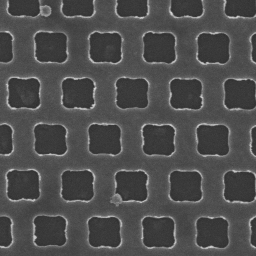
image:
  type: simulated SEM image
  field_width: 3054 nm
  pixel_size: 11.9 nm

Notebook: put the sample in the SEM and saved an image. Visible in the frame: a regular array of holes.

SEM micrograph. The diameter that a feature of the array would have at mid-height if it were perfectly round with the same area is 405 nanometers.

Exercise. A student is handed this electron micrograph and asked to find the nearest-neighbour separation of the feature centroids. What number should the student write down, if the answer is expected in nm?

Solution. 633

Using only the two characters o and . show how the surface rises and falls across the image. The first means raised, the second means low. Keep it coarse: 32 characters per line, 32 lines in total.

o....ooo....ooo...ooo....ooo....
o....ooo....ooo...ooo....ooo....
oooooooooooooooooooooooooooooooo
oooooooooooooooooooooooooooooooo
.ooo....ooo....ooo....ooo...oooo
.ooo....ooo....ooo....ooo....oo.
..oo....ooo....ooo....ooo....ooo
.oooo...oooo...ooo....ooo....ooo
oooooooooooooooooooooooooooooooo
oooooooooooooooooooooooooooooooo
o....ooo....ooo...ooo....ooo....
o....ooo....ooo...ooo....ooo....
o....ooo....ooo...ooo....ooo....
oo..oooo.o.oooo.oooooo...oooo...
oooooooooooooooooooooooooooooooo
ooooo.oooooooooooooooooooooooooo
..oo....ooo....ooo....ooo....oo.
..oo....ooo....ooo....ooo....oo.
..oo....ooo....ooo....ooo....oo.
oooooooooooooooooooooooooooooooo
oooooooooooooooooooooooooooooooo
o...oooo...oooo...oooo..oooooo.o
o....ooo....oo....ooo....ooo....
o....ooo....ooo...ooo....ooo....
o....ooo....ooo...ooo....ooo....
oooooooooooooooooooooooooooooooo
oooooooooooooooooooooooooooooooo
.ooo....ooo....ooo....ooo...oooo
.ooo....ooo....ooo....ooo....oo.
.ooo....ooo....ooo....ooo....oo.
.oooo...ooo....ooo....ooo...oooo
oooooooooooooooooooooooooooooooo